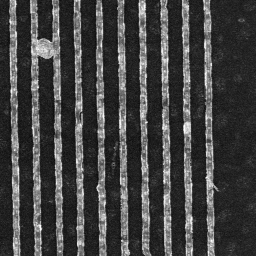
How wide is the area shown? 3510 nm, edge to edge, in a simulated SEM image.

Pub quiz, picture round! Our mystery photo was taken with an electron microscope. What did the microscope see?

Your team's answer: parallel lines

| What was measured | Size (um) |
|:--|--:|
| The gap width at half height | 0.214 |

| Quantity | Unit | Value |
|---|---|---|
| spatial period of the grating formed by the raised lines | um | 0.296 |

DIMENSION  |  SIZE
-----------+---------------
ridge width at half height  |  75.4 nm